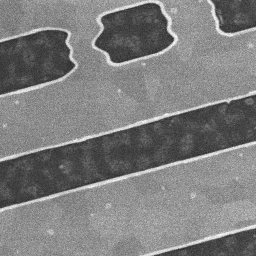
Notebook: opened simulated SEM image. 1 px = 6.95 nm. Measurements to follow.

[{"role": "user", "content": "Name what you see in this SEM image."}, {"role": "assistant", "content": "one or a few lines or trenches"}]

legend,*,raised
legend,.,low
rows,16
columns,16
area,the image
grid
********..***...
******.....***..
....**.....*****
....***..*******
....************
..**************
*************...
**********......
******..........
**............**
..........******
......**********
..**************
****************
***************.
***********.....